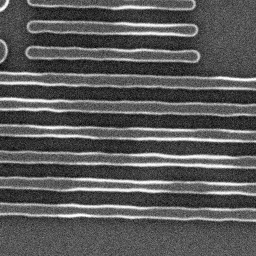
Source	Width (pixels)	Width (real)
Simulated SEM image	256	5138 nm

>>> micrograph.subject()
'groups of lines, slits or small figures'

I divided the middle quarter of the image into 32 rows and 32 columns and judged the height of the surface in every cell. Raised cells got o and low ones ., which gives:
................................
................................
................................
oooooooooooooooooooooooooooooooo
oooooooooooooooooooooooooooooooo
............oooooooooooooooooooo
................................
................................
................................
oooooooooooo.oooo...............
oooooooooooooooooooooooooooooooo
oooooooooooooooooooooooooooooooo
................................
................................
................................
................................
ooooooooooooooooooooooooooo.....
oooooooooooooooooooooooooooooooo
........oooooooooooooooooooooooo
................................
................................
................................
ooooooooooo.....................
oooooooooooooooooooooooooooooooo
oooooooooooooooooooooooooooooooo
................................
................................
................................
................................
ooooooooooooooooo...............
oooooooooooooooooooooooooooooooo
o...................oooooooooooo